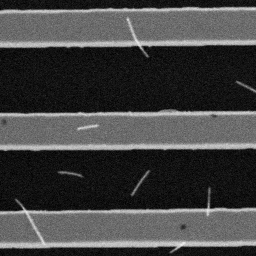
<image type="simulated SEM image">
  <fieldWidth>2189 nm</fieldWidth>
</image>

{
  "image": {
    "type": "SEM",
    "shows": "lines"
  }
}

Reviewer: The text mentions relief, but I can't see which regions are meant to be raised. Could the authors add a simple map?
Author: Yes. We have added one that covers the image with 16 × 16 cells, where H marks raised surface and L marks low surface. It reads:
LLLLLLLLLLLLLLHH
HHHHHHHHHHHHHHHH
HHHHHHHHHHHHHHHH
LLLLLLLLLLLLLLLL
LLLLLLLLLLLLLLLL
LLLLLLLLLLLLLLLL
LLLLLLLLLLLLLLLL
HHHHHHHHHHHHHHHH
HHHHHHHHHHHHHHHH
LLLLLLLLLLLLLLLL
LLLLLLLLLLLLLLLL
LLLLLLLLLLLLLLLL
LLLLLLLLLLLLLLLL
HHHHHHHHHHHHHHHH
HHHHHHHHHHHHHHHH
LLLLLLLLLLLLLLLL